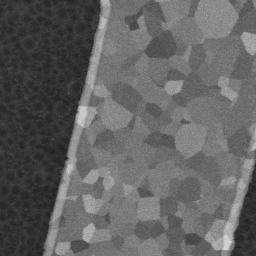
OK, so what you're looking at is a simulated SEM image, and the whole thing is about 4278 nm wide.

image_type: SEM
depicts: one or a few lines or trenches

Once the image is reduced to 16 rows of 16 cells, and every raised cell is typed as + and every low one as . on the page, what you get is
.......+++++++++
......++++++++++
......++++++++++
......++++++++++
......++++++++++
......++++++++++
.....+++++++++++
.....+++++++++++
.....+++++++++++
.....+++++++++++
....+++++++++++.
....+++++++++++.
....+++++++++++.
....+++++++++++.
...+++++++++++..
...+++++++++++..